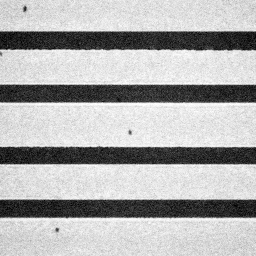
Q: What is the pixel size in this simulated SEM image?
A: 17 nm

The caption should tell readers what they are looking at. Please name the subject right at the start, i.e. lines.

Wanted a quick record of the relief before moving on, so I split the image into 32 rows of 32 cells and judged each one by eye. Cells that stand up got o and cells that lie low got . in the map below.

oooooooooooooooooooooooooooooooo
oooooooooooooooooooooooooooooooo
oooooooooooooooooooooooooooooooo
oooooooooooooooooooooooooooooooo
................................
................................
oooooooooooooooooooooooooooooooo
oooooooooooooooooooooooooooooooo
oooooooooooooooooooooooooooooooo
oooooooooooooooooooooooooooooooo
................................
................................
................................
oooooooooooooooooooooooooooooooo
oooooooooooooooooooooooooooooooo
oooooooooooooooooooooooooooooooo
oooooooooooooooooooooooooooooooo
oooooooooooooooooooooooooooooooo
................................
................................
................................
oooooooooooooooooooooooooooooooo
oooooooooooooooooooooooooooooooo
oooooooooooooooooooooooooooooooo
oooooooooooooooooooooooooooooooo
................................
................................
oooooooooooooooooooooooooooooooo
oooooooooooooooooooooooooooooooo
oooooooooooooooooooooooooooooooo
oooooooooooooooooooooooooooooooo
oooooooooooooooooooooooooooooooo